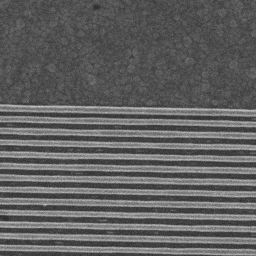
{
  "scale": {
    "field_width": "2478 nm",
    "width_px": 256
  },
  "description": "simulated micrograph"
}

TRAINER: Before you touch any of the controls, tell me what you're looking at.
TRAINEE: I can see parallel lines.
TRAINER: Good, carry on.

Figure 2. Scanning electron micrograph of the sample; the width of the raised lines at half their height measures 44.7 nm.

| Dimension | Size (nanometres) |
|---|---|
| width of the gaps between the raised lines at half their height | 62.9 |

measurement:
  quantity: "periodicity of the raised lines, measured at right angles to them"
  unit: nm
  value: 112